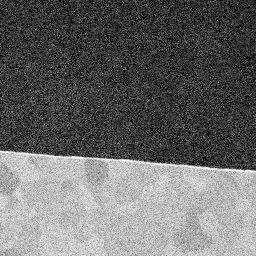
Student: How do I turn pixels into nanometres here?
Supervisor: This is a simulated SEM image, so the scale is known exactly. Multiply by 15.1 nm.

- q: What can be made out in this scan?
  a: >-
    one or a few lines or trenches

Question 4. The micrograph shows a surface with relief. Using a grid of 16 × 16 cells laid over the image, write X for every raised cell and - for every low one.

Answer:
----------------
----------------
----------------
----------------
----------------
----------------
----------------
----------------
----------------
----------------
XXXXXXXXXXXXX---
XXXXXXXXXXXXXXXX
XXXXXXXXXXXXXXXX
XXXXXXXXXXXXXXXX
XXXXXXXXXXXXXXXX
XXXXXXXXXXXXXXXX